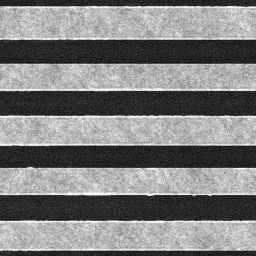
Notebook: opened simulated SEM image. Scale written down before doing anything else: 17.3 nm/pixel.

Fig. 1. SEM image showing lines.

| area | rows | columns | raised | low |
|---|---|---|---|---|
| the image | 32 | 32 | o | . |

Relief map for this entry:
................................
oooooooooooooooooooooooooooooooo
oooooooooooooooooooooooooooooooo
oooooooooooooooooooooooooooooooo
oooooooooooooooooooooooooooooooo
................................
................................
................................
oooooooooooooooooooooooooooooooo
oooooooooooooooooooooooooooooooo
oooooooooooooooooooooooooooooooo
................................
................................
................................
................................
oooooooooooooooooooooooooooooooo
oooooooooooooooooooooooooooooooo
oooooooooooooooooooooooooooooooo
................................
................................
................................
oooooooooooooooooooooooooooooooo
oooooooooooooooooooooooooooooooo
oooooooooooooooooooooooooooooooo
................................
................................
................................
................................
oooooooooooooooooooooooooooooooo
oooooooooooooooooooooooooooooooo
oooooooooooooooooooooooooooooooo
................................